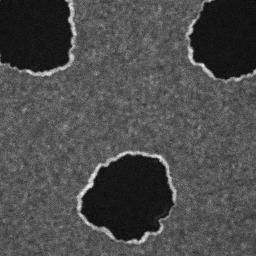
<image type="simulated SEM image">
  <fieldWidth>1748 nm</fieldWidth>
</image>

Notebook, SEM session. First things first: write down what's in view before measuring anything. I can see holes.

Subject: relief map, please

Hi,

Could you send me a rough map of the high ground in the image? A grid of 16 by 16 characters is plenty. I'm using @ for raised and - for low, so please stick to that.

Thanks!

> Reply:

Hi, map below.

----@@@@@@@@@---
----@@@@@@@@----
-----@@@@@@@----
----@@@@@@@@----
@@-@@@@@@@@@@---
@@@@@@@@@@@@@@@@
@@@@@@@@@@@@@@@@
@@@@@@@@@@@@@@@@
@@@@@@@@@@@@@@@@
@@@@@@@@@@@@@@@@
@@@@@@----@@@@@@
@@@@@@-----@@@@@
@@@@@------@@@@@
@@@@@-----@@@@@@
@@@@@@@--@@@@@@@
@@@@@@@@@@@@@@@@